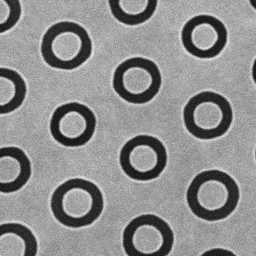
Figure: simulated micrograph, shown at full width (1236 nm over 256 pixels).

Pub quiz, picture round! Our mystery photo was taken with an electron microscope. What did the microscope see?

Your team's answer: a regular array of ring-shaped grooves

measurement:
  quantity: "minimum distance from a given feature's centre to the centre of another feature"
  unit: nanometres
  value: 378